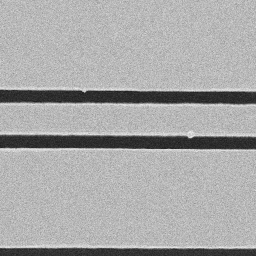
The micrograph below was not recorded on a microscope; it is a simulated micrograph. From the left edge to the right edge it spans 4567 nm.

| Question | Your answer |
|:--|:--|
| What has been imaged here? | lines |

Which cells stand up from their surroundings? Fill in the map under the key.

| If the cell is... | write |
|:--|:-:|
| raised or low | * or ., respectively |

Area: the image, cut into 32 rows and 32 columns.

********************************
********************************
********************************
********************************
********************************
********************************
********************************
********************************
********************************
********************************
********************************
................................
................................
********************************
********************************
********************************
********************************
................................
................................
********************************
********************************
********************************
********************************
********************************
********************************
********************************
********************************
********************************
********************************
********************************
********************************
................................